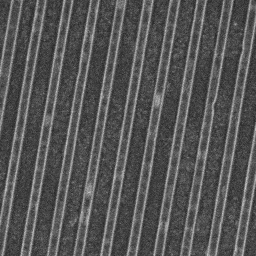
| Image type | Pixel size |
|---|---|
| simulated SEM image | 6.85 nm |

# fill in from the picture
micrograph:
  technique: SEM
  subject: parallel lines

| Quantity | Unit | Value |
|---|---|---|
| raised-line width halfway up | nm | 64.2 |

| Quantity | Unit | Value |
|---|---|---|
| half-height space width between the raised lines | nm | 116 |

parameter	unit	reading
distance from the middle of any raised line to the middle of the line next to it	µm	0.18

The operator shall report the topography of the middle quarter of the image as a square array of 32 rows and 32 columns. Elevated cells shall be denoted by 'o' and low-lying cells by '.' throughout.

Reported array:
....oo.....oo....oo.....oo.....o
....oo....oo.....oo.....oo....oo
....oo....oo.....oo.....oo....oo
...oo.....oo.....oo....ooo....oo
...oo.....oo.....oo....oo.....oo
...oo.....oo.....oo....oo.....oo
...oo.....oo....oo.....oo.....oo
...oo....oo.....oo.....oo....ooo
...oo....oo.....oo.....oo....oo.
..oo.....oo.....oo....oo.....oo.
..oo.....oo.....oo....oo.....oo.
..oo.....oo....ooo....oo.....oo.
..oo.....oo....oo.....oo.....oo.
..oo....oo.....oo.....oo....ooo.
..oo....oo.....oo.....oo....oo..
.oo.....oo.....oo....oo.....oo..
.oo.....oo.....oo....oo.....oo..
.oo.....oo....oo.....oo.....oo..
.oo.....oo....oo.....oo....ooo..
.oo....oo.....oo.....oo....ooo..
.oo....oo.....oo....ooo....oo...
oo.....oo.....oo....oo.....oo...
oo.....oo....ooo....oo.....oo...
oo.....oo....ooo....oo.....oo...
oo.....oo....oo.....oo....ooo...
oo....oo.....oo.....oo....ooo...
oo....oo.....oo....ooo....oo....
o.....oo.....oo....ooo....oo....
o.....oo....ooo....oo.....oo....
o.....oo....ooo....oo.....oo....
o....ooo....oo.....oo....oo.....
o....oo.....oo.....oo....oo.....